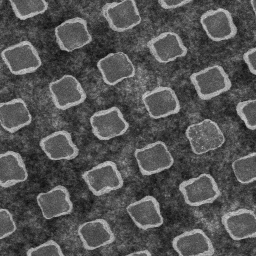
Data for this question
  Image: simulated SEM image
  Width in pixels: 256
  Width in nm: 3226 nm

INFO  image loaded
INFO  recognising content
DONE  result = a regular array of raised bodies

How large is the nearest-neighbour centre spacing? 683 nm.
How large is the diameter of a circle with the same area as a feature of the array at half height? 395 nanometers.